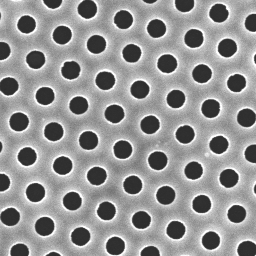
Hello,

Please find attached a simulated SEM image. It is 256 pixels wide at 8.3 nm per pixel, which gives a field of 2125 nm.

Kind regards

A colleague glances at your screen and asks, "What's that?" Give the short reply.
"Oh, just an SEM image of a regular array of holes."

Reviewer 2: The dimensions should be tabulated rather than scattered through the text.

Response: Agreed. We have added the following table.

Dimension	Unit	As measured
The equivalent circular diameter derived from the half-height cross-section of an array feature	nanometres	160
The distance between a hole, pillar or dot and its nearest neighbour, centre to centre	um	0.292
